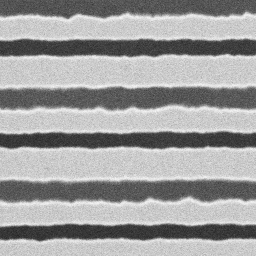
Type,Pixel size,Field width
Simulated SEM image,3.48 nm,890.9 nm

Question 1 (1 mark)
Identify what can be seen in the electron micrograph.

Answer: lines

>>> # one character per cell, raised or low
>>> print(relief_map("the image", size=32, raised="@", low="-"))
--------------------------------
--------------------------------
@@@@@@@@@@@@@@@@@@@@@@@@@@@@@@@@
@@@@@@@@@@@@@@@@@@@@@@@@@@@@@@@@
@@@@@@@@@@@@@@@@@@@@@@@@@@@@@@@@
--------------------------------
--------------------------------
@@@@@@@@@@@@@@@@@@@@@@@@@@@@@@@@
@@@@@@@@@@@@@@@@@@@@@@@@@@@@@@@@
@@@@@@@@@@@@@@@@@@@@@@@@@@@@@@@@
@@@@@@@@@@@@@@@@@@@@@@@@@@@@@@@@
--------------------------------
--------------------------------
--------------------@@@--@------
@@@@@@@@@@@@@@@@@@@@@@@@@@@@@@@@
@@@@@@@@@@@@@@@@@@@@@@@@@@@@@@@@
@@@@@@--@@@@@@@@@-----@@-@---@@@
--------------------------------
---------------@----------------
@@@@@@@@@@@@@@@@@@@@@@@@@@@@@@@@
@@@@@@@@@@@@@@@@@@@@@@@@@@@@@@@@
@@@@@@@@@@@@@@@@@@@@@@@@@@@@@@@@
-----@--@-----------------------
--------------------------------
--------------------------------
@-@@@@@@@@@@@@-@@@@@@@@@@@@@@@@@
@@@@@@@@@@@@@@@@@@@@@@@@@@@@@@@@
@@@@@@@@@@@@@@@@@@@@@@@@@@@@@@@@
--------------------------------
--------------------------------
@@@@@@@@@@@@@@@@@@@@@@@@@@@@@@@@
@@@@@@@@@@@@@@@@@@@@@@@@@@@@@@@@